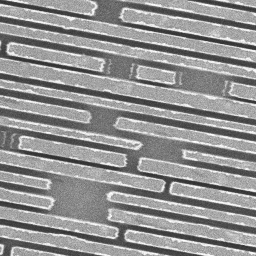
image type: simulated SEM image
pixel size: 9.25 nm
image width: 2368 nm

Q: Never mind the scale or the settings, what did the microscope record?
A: parallel lines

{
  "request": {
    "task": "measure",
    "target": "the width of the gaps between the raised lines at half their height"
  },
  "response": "51.2 nanometres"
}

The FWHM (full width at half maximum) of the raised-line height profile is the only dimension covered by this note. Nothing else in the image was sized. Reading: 118 nanometres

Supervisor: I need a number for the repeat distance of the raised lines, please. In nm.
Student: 168